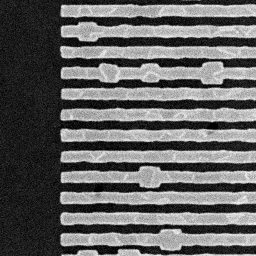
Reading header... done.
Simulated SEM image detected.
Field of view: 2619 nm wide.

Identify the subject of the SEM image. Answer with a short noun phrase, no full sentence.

wiring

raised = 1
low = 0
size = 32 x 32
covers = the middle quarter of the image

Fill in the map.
00000000011110000000111100000000
11111111111111111111111111111111
11111111111111111111111111111111
11011111111111111111111111111111
00000000000000000000000000000000
00000000000000000000000000000000
11111111111111111111111111111111
11111111111111111111111111111111
11111111111111111111111111111111
00000000000000000000000000000000
00000000000000000000000000000000
00111111000111111111111110000000
11111111111111111111111111111111
11111111111111111111111111111111
00000000000000000000000000000000
00000000000000000000000000000000
10001110000000000000000000000111
11111111111111111111111111111111
11111111111111111111111111111111
00000000000000000000000000000000
00000000000000000000000000000000
00000000000000000000000000000000
11111111111111111111111111111111
11111111111111111111111111111111
00000000000000000000000000000000
00000000000000000000000000000000
00000000000000000001111100000000
11111111111111111111111111111111
11111111111111111111111111111111
00000000000000000011111110000000
00000000000000000001111100000000
00000000000000000000000000000000